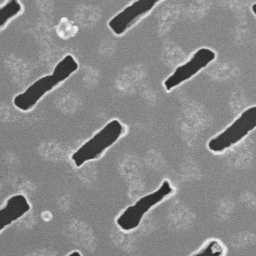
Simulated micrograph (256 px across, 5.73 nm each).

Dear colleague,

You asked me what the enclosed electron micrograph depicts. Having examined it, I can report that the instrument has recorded holes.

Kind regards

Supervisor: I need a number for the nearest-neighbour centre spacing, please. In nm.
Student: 451